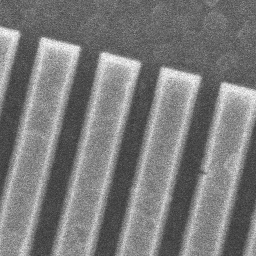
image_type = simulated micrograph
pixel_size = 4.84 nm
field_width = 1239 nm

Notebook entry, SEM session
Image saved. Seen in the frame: parallel lines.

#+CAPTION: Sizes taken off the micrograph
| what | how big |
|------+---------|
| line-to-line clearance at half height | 130 nanometers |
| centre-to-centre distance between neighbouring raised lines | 0.299 micrometres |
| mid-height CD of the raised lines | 170 nm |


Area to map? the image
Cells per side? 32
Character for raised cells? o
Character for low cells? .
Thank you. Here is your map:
................................
................................
................................
................................
oo..............................
oo...oo.........................
oo...ooooo......................
o....oooo....oo.................
o....oooo....oooo...............
o...ooooo...ooooo...ooo.........
o...ooooo...ooooo...ooooo.......
....oooo....oooo....oooo....ooo.
....oooo....oooo....oooo....oooo
...ooooo...ooooo...ooooo...ooooo
...ooooo...ooooo...ooooo...ooooo
...oooo....oooo....oooo....oooo.
...oooo....oooo...ooooo...ooooo.
..ooooo...ooooo...ooooo...ooooo.
..ooooo...ooooo...ooooo...ooooo.
..oooo....oooo....oooo....oooo..
..oooo....oooo...ooooo....oooo..
.ooooo...ooooo...ooooo...ooooo..
.ooooo...ooooo...ooooo...ooooo..
.oooo....oooo....oooo....oooo...
.oooo....oooo....oooo....oooo...
ooooo...ooooo...ooooo...ooooo...
ooooo...ooooo...ooooo...ooooo...
oooo....oooo....oooo....oooo....
oooo....oooo....oooo....oooo....
oooo...ooooo...ooooo...ooooo...o
oooo...ooooo...ooooo...ooooo...o
ooo....oooo....oooo....oooo....o